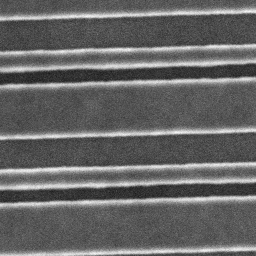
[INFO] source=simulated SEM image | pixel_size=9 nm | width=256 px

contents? lines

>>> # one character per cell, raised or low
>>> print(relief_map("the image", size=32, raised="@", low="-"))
@@@@@@@@@@@@@@@@@@@@@@@@@@@@@@@@
@@@@@@@@@@@@@@@@@@@@@@@@@@@@@@@@
--------------------------------
--------------------------------
--------------------------------
--------------------------------
--@@@@@@@@@@@@@@@@@@@@@@@@@@@@@@
@@@@@@@@@@@@@@@@@@@@@@@@@@@@@@@@
@@@@@@@@------------------------
--------------------------------
---------@@@@@@@@@@@@@@@@@@@@@@@
@@@@@@@@@@@@@@@@@@@@@@@@@@@@@@@@
@@@@@@@@@@@@@@@@@@@@@@@@@@@@@@@@
@@@@@@@@@@@@@@@@@@@@@@@@@@@@@@@@
@@@@@@@@@@@@@@@@@@@@@@@@@@@@@@@@
@@@@@@@@@@@@@@@@@@@@@@@@@@@@@@@@
@@@@@@@@@@@@@@@@@@@@@@@@@@@@----
--------------------------------
--------------------------------
--------------------------------
----------------------------@@@@
@@@@@@@@@@@@@@@@@@@@@@@@@@@@@@@@
@@@@@@@@@@@@@@@@@@@@@@@@@@@@@@@@
@-------------------------------
--------------------------------
-@@@@@@@@@@@@@@@@@@@@@@@@@@@@@@@
@@@@@@@@@@@@@@@@@@@@@@@@@@@@@@@@
@@@@@@@@@@@@@@@@@@@@@@@@@@@@@@@@
@@@@@@@@@@@@@@@@@@@@@@@@@@@@@@@@
@@@@@@@@@@@@@@@@@@@@@@@@@@@@@@@@
@@@@@@@@@@@@@@@@@@@@@@@@@@@@@@@@
@@@@@@@@@@@@@@@@@@@@@-----------